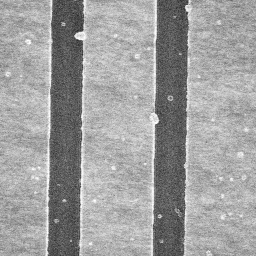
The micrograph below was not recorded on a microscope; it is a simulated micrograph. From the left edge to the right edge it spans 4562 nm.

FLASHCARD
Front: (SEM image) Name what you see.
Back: lines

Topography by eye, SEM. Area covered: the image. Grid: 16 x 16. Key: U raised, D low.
UUUDDUUUUUDDUUUU
UUUDDUUUUUDDUUUU
UUUDDUUUUUDDUUUU
UUUDDUUUUUDDUUUU
UUUDDUUUUUDDUUUU
UUUDDUUUUUDDUUUU
UUUDDUUUUUDDUUUU
UUUDDUUUUUDDUUUU
UUUDDUUUUUDDUUUU
UUUDDUUUUUDDUUUU
UUUDDUUUUUDDUUUU
UUUDDUUUUUDDUUUU
UUUDDUUUUUDDUUUU
UUUDDUUUUUDDUUUU
UUUDDUUUUDDDUUUU
UUUDDUUUUDDDUUUU